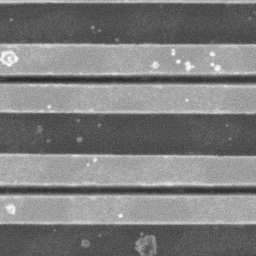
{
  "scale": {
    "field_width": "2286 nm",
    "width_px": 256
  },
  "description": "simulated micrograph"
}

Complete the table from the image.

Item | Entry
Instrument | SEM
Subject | lines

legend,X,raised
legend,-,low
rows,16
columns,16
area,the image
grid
----------------
----------------
----------------
XXXXXXXXXXXXXXXX
XXXXXXXXXXXXXXXX
XXXXXXXXXXXXXXXX
XXXXXXXXXXXXXXXX
----------------
----------------
----------------
XXXXXXXXXXXXXXXX
XXXXXXXXXXXXXXXX
XXXXXXXXXXXXXXXX
XXXXXXXXXXXXXXXX
----------------
----------------